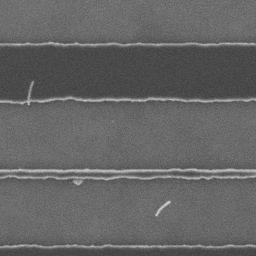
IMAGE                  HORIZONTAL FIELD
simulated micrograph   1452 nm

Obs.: lines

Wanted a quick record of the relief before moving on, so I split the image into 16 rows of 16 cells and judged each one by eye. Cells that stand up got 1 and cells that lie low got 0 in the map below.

0000000000000000
0000000000000000
0000000000000000
1111111111111111
1111111111111111
1111111111111111
0000000000000000
0000000000000000
0000000000000000
0000000000000000
0000000000000000
0000000000000000
0000000000000000
0000000000000000
0000000000000000
1111111111111111